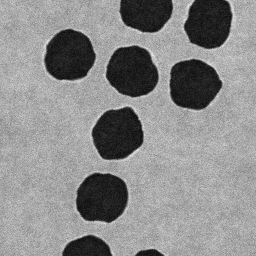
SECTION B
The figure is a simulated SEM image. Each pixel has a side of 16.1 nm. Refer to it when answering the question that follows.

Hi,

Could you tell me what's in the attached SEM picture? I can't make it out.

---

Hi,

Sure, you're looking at holes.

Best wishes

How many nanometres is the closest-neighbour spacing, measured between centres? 1030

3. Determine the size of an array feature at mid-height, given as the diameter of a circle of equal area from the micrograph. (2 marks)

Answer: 838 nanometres